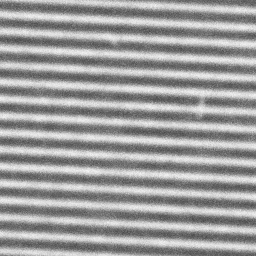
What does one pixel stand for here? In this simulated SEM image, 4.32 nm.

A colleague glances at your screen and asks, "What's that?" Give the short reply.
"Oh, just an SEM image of parallel lines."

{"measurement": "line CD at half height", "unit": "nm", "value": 21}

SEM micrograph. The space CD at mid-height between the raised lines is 53.9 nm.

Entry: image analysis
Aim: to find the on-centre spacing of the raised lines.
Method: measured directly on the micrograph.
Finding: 72.8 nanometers